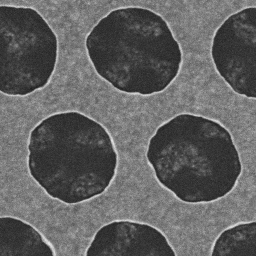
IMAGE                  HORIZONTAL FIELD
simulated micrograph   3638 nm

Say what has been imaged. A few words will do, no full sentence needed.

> holes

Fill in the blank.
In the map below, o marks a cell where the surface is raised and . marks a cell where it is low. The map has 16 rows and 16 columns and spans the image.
.ooooooooooooooo
...ooo....oooo..
....o......oo...
....oo.....oo...
...ooo.....ooo..
..ooooo...ooooo.
oooooooooooooooo
ooo...ooooo..ooo
oo.....ooo....oo
oo.....oo......o
oo.....ooo.....o
oo.....ooo.....o
oooo.oooooo..ooo
oooooooooooooooo
..oooo....oooo..
...ooo.....oo...